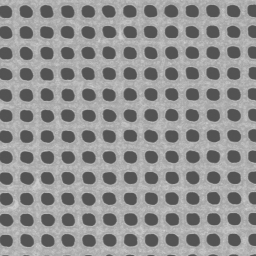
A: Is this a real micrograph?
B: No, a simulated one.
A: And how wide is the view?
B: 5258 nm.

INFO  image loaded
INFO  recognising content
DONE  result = a regular array of holes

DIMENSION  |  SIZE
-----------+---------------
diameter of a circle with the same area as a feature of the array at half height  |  273 nm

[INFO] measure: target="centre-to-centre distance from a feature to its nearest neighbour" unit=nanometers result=421